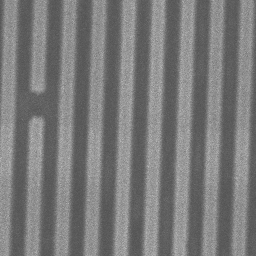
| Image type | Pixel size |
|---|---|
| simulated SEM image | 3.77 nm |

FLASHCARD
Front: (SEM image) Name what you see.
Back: parallel lines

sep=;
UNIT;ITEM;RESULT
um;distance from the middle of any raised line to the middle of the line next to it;0.111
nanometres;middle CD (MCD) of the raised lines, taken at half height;53.2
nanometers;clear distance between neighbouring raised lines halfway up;57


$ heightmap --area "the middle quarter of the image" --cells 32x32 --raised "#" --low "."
###....###....###....####....###
###....###....###....####....###
##.....###....###....####....###
##.....###....###....####....###
##.....###....###....####....###
##.....###....###....####....###
##.....###....###....####....###
##.....###....###....####....###
##.....###....###....###.....###
##....####....###....###.....###
##....####....###....###.....###
##....###.....###....###.....###
##....###.....###....###....####
##....###.....###....###....####
##....###.....###....###....####
##....###.....###....###....####
##....###.....###....###....####
##....###.....###....###....####
##....###....####....###....####
##....###....####....###....####
##....###....####....###....####
##....###....####....###....###.
##....###....####....###....###.
##....###....####....###....###.
##....###....####....###....###.
##....###....####....###....###.
##....###....####....###....###.
##....###....####....###....###.
##....###....###....####....###.
##....###....###....####....###.
##....###....###....####....###.
##....###....###....####....###.